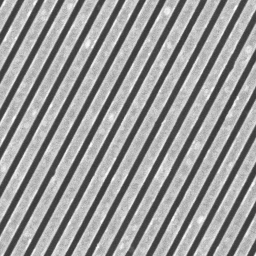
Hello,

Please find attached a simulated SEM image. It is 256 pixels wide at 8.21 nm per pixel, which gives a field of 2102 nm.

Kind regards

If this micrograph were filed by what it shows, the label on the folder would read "parallel lines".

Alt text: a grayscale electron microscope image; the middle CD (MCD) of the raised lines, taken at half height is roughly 97.9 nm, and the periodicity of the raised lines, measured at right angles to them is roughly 147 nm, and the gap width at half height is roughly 0.049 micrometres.